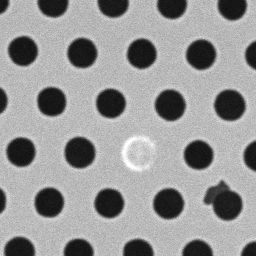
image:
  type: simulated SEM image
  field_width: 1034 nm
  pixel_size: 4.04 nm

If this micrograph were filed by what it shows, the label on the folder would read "a regular array of holes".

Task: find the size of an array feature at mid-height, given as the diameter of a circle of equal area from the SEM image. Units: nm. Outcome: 121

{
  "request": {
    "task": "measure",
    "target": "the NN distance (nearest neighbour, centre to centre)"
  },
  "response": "57.7 px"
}